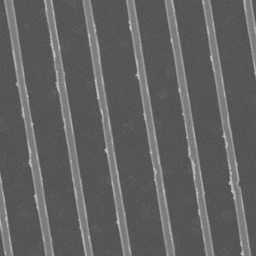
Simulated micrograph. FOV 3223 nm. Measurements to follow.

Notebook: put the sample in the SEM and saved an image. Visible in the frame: parallel lines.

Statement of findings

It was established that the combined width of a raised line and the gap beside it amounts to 492 nm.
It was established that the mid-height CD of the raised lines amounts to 101 nanometers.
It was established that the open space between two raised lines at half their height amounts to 0.382 µm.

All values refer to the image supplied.